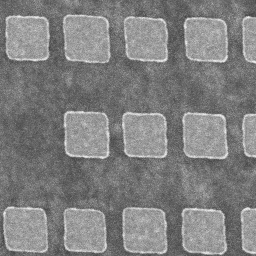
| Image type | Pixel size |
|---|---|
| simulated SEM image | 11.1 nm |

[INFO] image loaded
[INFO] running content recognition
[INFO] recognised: a regular array of raised bodies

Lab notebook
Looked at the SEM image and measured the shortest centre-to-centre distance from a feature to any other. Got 59.4 px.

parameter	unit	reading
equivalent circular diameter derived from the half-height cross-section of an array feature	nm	532